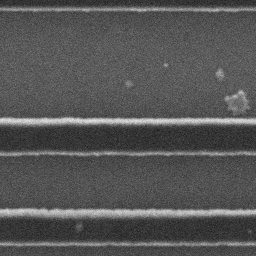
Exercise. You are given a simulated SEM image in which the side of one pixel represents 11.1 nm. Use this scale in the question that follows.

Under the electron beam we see lines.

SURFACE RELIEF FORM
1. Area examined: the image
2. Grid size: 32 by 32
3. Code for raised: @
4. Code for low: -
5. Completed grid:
@@@@@@@@@@@@@@@@@@@@@@@@@@@@@@@@
--------------------------------
--------------------------------
--------------------------------
--------------------------------
--------------------------------
--------------------------------
--------------------------------
--------------------------------
--------------------------------
--------------------------------
--------------------------------
--------------------------------
--------------------------------
--------------------------------
@@@@@@@@@@@@@@@@@@@@@@@@@@@@@@@@
@@@@@@@@@@@@@@@@@@@@@@@@@@@@@@@@
@@@@@@@@@@@@@@@@@@@@@@@@@@@@@@@@
@@@@@@@@@@@@@@@@@@@@@@@@@@@@@@@@
--------------------------------
--------------------------------
--------------------------------
--------------------------------
--------------------------------
--------------------------------
--------------------------------
@@@@@@@@@@@@@@@@@@@@@@@@@@@@@@@@
@@@@@@@@@@@@@@@@@@@@@@@@@@@@@@@@
@@@@@@@@@@@@@@@@@@@@@@@@@@@@@@@@
@@@@@@@@@@@@@@@@@@@@@@@@@@@@@@@@
@@@@@@@@@@@@@@@@@@@@@@@@@@@@@@@@
--------------------------------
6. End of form